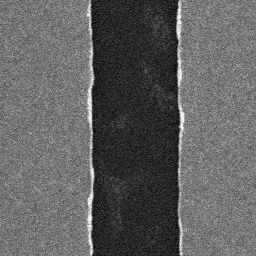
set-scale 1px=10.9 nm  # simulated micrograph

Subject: one or a few lines or trenches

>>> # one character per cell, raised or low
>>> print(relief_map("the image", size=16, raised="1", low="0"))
1111110000011111
1111110000011111
1111110000011111
1111110000011111
1111110000011111
1111110000011111
1111110000011111
1111110000011111
1111110000011111
1111110000011111
1111110000011111
1111110000011111
1111110000011111
1111110000011111
1111110000011111
1111110000011111